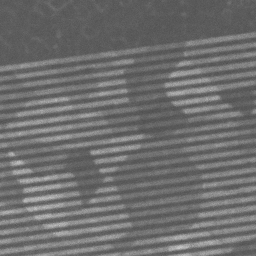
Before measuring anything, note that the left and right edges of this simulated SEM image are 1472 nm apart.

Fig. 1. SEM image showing parallel lines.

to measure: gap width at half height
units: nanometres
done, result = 32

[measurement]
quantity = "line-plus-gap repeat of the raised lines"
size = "54.9 nanometers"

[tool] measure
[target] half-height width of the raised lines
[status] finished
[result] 0.0249 micrometres